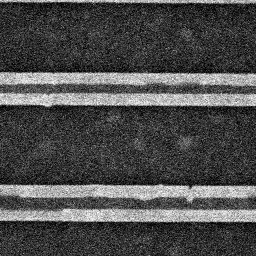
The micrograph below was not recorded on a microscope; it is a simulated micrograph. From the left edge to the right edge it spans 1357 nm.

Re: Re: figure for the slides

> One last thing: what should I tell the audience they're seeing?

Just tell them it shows one or a few lines or trenches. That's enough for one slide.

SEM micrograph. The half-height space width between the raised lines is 467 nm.